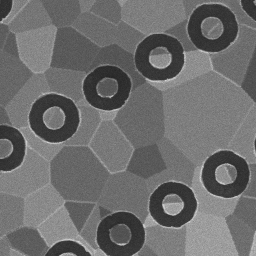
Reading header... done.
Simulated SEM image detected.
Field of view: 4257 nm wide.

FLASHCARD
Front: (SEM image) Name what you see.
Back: ring-shaped grooves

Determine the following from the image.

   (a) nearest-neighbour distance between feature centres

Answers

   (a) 1010 nm